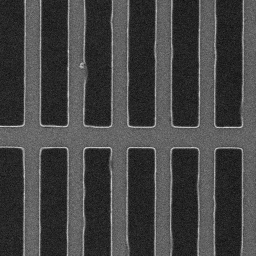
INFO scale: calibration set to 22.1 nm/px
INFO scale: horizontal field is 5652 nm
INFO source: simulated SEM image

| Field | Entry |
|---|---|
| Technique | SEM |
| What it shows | groups of lines, slits or small figures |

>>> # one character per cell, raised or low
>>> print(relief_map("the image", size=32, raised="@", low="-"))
@@@--@@@@--@@@--@@@@-@@@@--@@@--
@@@--@@@@--@@@--@@@@-@@@@--@@@--
@@@--@@@@--@@@--@@@@-@@@@--@@@--
@@@--@@@@--@@@--@@@@-@@@@--@@@--
@@@--@@@@--@@@--@@@@-@@@@--@@@--
@@@--@@@@--@@@--@@@--@@@@--@@@--
@@@--@@@@--@@@--@@@--@@@@--@@@--
@@@--@@@@-@@@@--@@@@-@@@@--@@@--
@@@--@@@@-@@@@--@@@@-@@@@--@@@--
@@@--@@@@--@@@--@@@--@@@@--@@@--
@@@--@@@@--@@@--@@@--@@@@--@@@--
@@@--@@@@--@@@--@@@--@@@@--@@@--
@@@--@@@@--@@@--@@@--@@@@--@@@--
@@@--@@@@--@@@--@@@--@@@@--@@@--
@@@--@@@@--@@@--@@@--@@@@--@@@--
@@@--@@@---@@@--@@@---@@@--@@@--
--------------------------------
--------------------------------
@@@--@@@---@@@--@@@---@@@--@@@--
@@@--@@@@--@@@--@@@--@@@@--@@@--
@@@--@@@@--@@@--@@@--@@@@--@@@--
@@@--@@@@--@@@--@@@--@@@@--@@@--
@@@--@@@@-@@@@--@@@--@@@@--@@@--
@@@--@@@@--@@@--@@@--@@@@--@@@--
@@@--@@@@--@@@--@@@--@@@@--@@@--
@@@--@@@@-@@@@--@@@--@@@@--@@@--
@@@--@@@---@@@--@@@--@@@@--@@@--
@@@--@@@---@@@--@@@--@@@@--@@@--
@@@--@@@--@@@@--@@@--@@@@--@@@--
@@@--@@@--@@@@--@@@--@@@@--@@@--
@@@--@@@--@@@@--@@@--@@@@--@@@--
@@@--@@@--@@@@--@@@--@@@@--@@@--